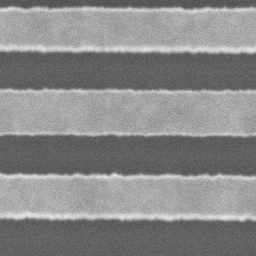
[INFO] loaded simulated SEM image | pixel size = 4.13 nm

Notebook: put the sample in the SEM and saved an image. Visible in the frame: lines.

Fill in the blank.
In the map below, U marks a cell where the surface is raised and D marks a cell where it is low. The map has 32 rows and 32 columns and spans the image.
DDDDDDDDDDDDDDDDDDDDDDDDDDDDDDDD
UUUUUUUUUUUUUUUUUUUUUUUUUUUUUUUU
UUUUUUUUUUUUUUUUUUUUUUUUUUUUUUUU
UUUUUUUUUUUUUUUUUUUUUUUUUUUUUUUU
UUUUUUUUUUUUUUUUUUUUUUUUUUUUUUUU
UUUUUUUUUUUUUUUUUUUUUUUUUUUUUUUU
DDDDDUDDDUDDUUDDUUUDUUUUUUUUUUUU
DDDDDDDDDDDDDDDDDDDDDDDDDDDDDDDD
DDDDDDDDDDDDDDDDDDDDDDDDDDDDDDDD
DDDDDDDDDDDDDDDDDDDDDDDDDDDDDDDD
DDDDDDDDDDDDDDDDDDDDDDDDDDDDDDDD
UUUUUUUUUUUUUUUUUUUUUUUUUUUUUUUU
UUUUUUUUUUUUUUUUUUUUUUUUUUUUUUUU
UUUUUUUUUUUUUUUUUUUUUUUUUUUUUUUU
UUUUUUUUUUUUUUUUUUUUUUUUUUUUUUUU
UUUUUUUUUUUUUUUUUUUUUUUUUUUUUUUU
UUUUUUUUUUUUUUUUUUUUUUUUUUUUUUUU
DDDDDDDDDDDDDDDDDDDDDDDDDDDDDDDD
DDDDDDDDDDDDDDDDDDDDDDDDDDDDDDDD
DDDDDDDDDDDDDDDDDDDDDDDDDDDDDDDD
DDDDDDDDDDDDDDDDDDDDDDDDDDDDDDDD
DDDDDDDDDDDDDDDDDDDDDDDDDDDDDDDD
UUUUUUUUUUUUUUUUUUUUUUUUUUUUUUUU
UUUUUUUUUUUUUUUUUUUUUUUUUUUUUUUU
UUUUUUUUUUUUUUUUUUUUUUUUUUUUUUUU
UUUUUUUUUUUUUUUUUUUUUUUUUUUUUUUU
UUUUUUUUUUUUUUUUUUUUUUUUUUUUUUUU
DDDDDDDDDDDDDDDDDDDDDUDDDDDDUDUU
DDDDDDDDDDDDDDDDDDDDDDDDDDDDDDDD
DDDDDDDDDDDDDDDDDDDDDDDDDDDDDDDD
DDDDDDDDDDDDDDDDDDDDDDDDDDDDDDDD
DDDDDDDDDDDDDDDDDDDDDDDDDDDDDDDD